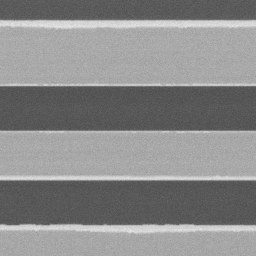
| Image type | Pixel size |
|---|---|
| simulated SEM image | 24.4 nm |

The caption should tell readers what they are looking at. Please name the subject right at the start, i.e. lines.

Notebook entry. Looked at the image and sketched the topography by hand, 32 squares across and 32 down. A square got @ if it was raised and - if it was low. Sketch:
--------------------------------
--------------------------------
--------------------------------
@@@@@@@@@@@@@@@@@@@@@@@@@@@@@@@@
@@@@@@@@@@@@@@@@@@@@@@@@@@@@@@@@
@@@@@@@@@@@@@@@@@@@@@@@@@@@@@@@@
@@@@@@@@@@@@@@@@@@@@@@@@@@@@@@@@
@@@@@@@@@@@@@@@@@@@@@@@@@@@@@@@@
@@@@@@@@@@@@@@@@@@@@@@@@@@@@@@@@
@@@@@@@@@@@@@@@@@@@@@@@@@@@@@@@@
@@@@@@@@@@@@@@@@@@@@@@@@@@@@@@@@
--------------------------------
--------------------------------
--------------------------------
--------------------------------
--------------------------------
@@@@@@@@@@@@@@@@@@@@@@@@@@@@@@@@
@@@@@@@@@@@@@@@@@@@@@@@@@@@@@@@@
@@@@@@@@@@@@@@@@@@@@@@@@@@@@@@@@
@@@@@@@@@@@@@@@@@@@@@@@@@@@@@@@@
@@@@@@@@@@@@@@@@@@@@@@@@@@@@@@@@
@@@@@@@@@@@@@@@@@@@@@@@@@@@@@@@@
--------------------------------
--------------------------------
--------------------------------
--------------------------------
--------------------------------
--------------------------------
@@@@@@@@@@@@@@---------@@@@@@@@@
@@@@@@@@@@@@@@@@@@@@@@@@@@@@@@@@
@@@@@@@@@@@@@@@@@@@@@@@@@@@@@@@@
@@@@@@@@@@@@@@@@@@@@@@@@@@@@@@@@